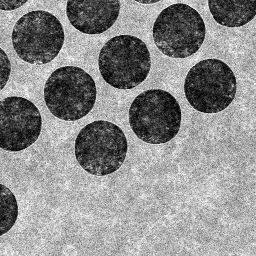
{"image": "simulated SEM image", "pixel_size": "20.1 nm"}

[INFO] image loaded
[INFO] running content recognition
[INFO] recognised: holes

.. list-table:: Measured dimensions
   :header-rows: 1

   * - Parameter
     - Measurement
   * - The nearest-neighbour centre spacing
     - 1.26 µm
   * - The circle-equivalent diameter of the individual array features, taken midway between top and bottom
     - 1070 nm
